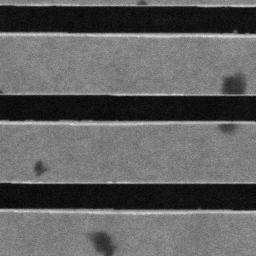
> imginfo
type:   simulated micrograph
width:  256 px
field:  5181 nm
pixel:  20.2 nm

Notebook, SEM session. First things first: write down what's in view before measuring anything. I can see lines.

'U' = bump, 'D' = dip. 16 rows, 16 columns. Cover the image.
DDDDDDDDDDDDDDDD
DDDDDDDDDDDDDDDD
UUUUUUUUUUUUUUUU
UUUUUUUUUUUUUUUU
UUUUUUUUUUUUUUUU
UUUUUUUUUUUUUUUU
DDDDDDDDDDDDDDDD
DDDDDDDDDDDDDDDD
UUUUUUUUUUUUUUUU
UUUUUUUUUUUUUUUU
UUUUUUUUUUUUUUUU
DDDDDDDDDDDDDDDD
DDDDDDDDDDDDDDDD
UUUUUUUUUUUUUUUU
UUUUUUUUUUUUUUUU
UUUUUUUUUUUUUUUU